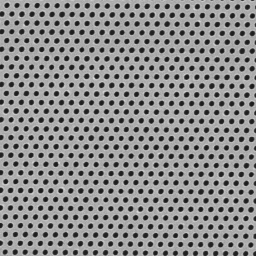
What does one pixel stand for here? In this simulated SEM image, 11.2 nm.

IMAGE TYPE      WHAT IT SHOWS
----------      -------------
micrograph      a regular array of holes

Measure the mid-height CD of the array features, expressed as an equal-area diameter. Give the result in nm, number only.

60.6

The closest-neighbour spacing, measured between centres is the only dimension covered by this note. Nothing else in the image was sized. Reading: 0.11 micrometres